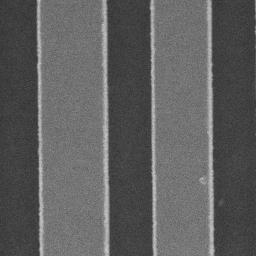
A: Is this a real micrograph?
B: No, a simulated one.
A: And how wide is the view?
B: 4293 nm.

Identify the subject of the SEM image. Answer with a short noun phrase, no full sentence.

lines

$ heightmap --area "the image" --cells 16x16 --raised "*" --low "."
..*****..****...
..*****..****...
..*****..****...
..*****..****...
..*****..****...
..*****...***...
..*****...***...
..*****...***...
..*****...***...
..*****...***...
..*****...***...
..*****...***...
..*****...***...
..*****...***...
..*****...***...
...****...***...